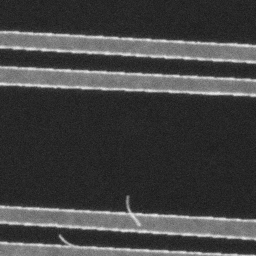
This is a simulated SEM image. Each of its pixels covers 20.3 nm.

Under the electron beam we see lines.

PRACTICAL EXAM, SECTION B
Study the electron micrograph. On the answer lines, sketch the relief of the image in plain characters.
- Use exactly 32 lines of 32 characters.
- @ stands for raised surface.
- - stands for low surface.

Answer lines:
--------------------------------
--------------------------------
--------------------------------
--------------------------------
@@@@@@@@@@@---------------------
@@@@@@@@@@@@@@@@@@@@@@@@@@@-----
----------@@@@@@@@@@@@@@@@@@@@@@
---------------------------@@@@@
@@------------------------------
@@@@@@@@@@@@@@@@@@@@@@@---------
@@@@@@@@@@@@@@@@@@@@@@@@@@@@@@@@
---------------------@@@@@@@@@@@
--------------------------------
--------------------------------
--------------------------------
--------------------------------
--------------------------------
--------------------------------
--------------------------------
--------------------------------
--------------------------------
--------------------------------
--------------------------------
--------------------------------
--------------------------------
--------------------------------
@@@@@@@@@@@@@@------------------
@@@@@@@@@@@@@@@@@@@@@@@@@@@@@@--
-----------@@@@@@@@@@@@@@@@@@@@@
-------------------------@@@@@@@
@@@-----------------------------
@@@@@@@@@@@@@@@@@@@@@@@---------